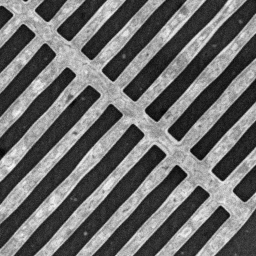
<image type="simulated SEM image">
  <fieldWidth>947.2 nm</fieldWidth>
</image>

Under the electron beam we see groups of lines, slits or small figures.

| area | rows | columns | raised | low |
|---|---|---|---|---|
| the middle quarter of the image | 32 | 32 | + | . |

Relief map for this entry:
++++++++++......++++......+++++.
..+++++++......++++......+++++..
...+++++++....++++......+++++...
...++++++++...+++.......++++....
..++++++++++++++.......++++.....
.+++++.++++++++.......++++......
+++++...+++++++......++++......+
++++.....++++++.....++++......++
+++......+++++++...++++......+++
+.......++++++++++++++......++++
+......++++..++++++++......++++.
......++++....++++++......++++..
.....++++......+++++.....++++...
....++++......++++++++..++++....
....++++.....+++++++++++++++....
...++++.....++++..+++++++++.....
..++++.....+++++...+++++++.....+
++..+.....+++++.....++++++.....+
++++.....+++++......+++++++...++
+++.....+++++......+++++++++.+++
++......++++......++++..++++++++
+......++++......++++....+++++++
......++++......++++......++++++
.....+++++......+++......+++++++
....++++.......+++......++++++++
....+++.......+++......+++++.+++
...+++.......+++......+++.+...++
..+++.......+++......+++++.....+
.+++.......+++.......++++......+
+++.......+++.......++++.....+++
+++......++++......++++.....++++
++......++++......++++......++++